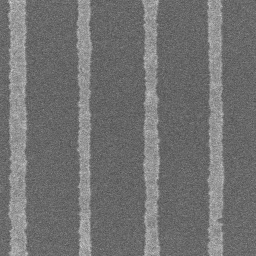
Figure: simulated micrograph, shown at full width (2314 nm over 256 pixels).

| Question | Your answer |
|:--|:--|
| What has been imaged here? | one or a few lines or trenches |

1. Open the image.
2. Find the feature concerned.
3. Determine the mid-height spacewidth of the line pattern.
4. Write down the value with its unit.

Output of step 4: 493 nm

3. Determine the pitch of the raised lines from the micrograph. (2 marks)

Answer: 596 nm